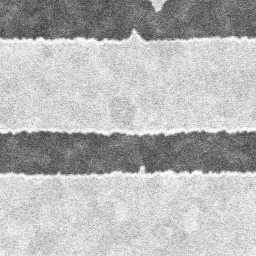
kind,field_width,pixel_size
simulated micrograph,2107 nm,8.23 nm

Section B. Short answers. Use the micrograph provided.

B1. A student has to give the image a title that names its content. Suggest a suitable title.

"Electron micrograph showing one or a few lines or trenches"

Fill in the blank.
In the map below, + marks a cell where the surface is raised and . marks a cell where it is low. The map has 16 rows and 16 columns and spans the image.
................
................
........+....+++
++++++++++++++++
++++++++++++++++
++++++++++++++++
++++++++++++++++
++++++++++++++++
................
................
................
++++++++++++++++
++++++++++++++++
++++++++++++++++
++++++++++++++++
++++++++++++++++